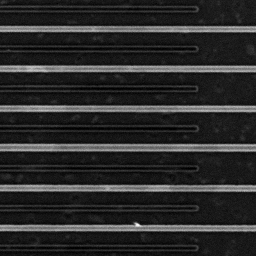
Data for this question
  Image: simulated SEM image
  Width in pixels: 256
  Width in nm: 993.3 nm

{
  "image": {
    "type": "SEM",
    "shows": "parallel lines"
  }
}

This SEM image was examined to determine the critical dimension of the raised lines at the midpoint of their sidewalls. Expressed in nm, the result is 20.9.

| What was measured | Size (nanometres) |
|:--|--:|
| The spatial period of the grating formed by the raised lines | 77.3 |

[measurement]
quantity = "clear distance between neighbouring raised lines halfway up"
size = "14.3 pixels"